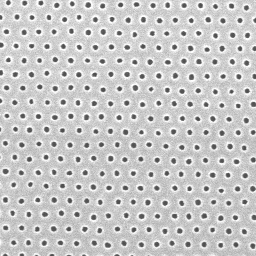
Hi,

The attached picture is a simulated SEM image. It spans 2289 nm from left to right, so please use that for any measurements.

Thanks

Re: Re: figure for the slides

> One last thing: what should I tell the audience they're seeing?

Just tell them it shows a regular array of holes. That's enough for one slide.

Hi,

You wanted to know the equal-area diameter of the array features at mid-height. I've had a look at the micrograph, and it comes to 50.4 nm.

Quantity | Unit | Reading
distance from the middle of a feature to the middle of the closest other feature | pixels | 14.8